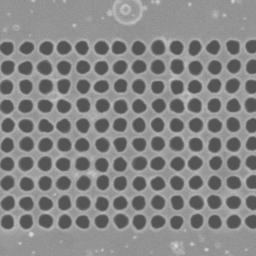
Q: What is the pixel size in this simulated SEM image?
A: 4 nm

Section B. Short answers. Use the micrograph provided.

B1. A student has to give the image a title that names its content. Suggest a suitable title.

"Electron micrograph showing a regular array of holes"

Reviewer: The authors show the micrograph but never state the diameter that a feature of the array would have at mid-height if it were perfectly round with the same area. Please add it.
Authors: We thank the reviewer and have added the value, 55 nm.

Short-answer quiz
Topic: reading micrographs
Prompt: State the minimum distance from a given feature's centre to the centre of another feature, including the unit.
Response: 18.2 px